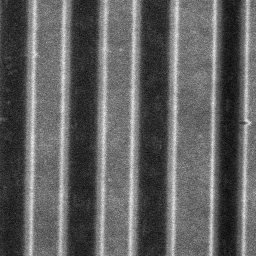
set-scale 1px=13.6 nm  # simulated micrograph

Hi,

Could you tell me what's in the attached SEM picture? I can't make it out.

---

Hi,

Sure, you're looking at one or a few lines or trenches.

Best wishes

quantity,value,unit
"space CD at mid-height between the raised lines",498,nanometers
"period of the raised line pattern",993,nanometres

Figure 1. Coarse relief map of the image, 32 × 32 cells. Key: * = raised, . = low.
....****.....****.....*****....*
....****.....****.....*****....*
....****.....****.....*****....*
....****.....****.....*****....*
....****.....****.....*****....*
....****.....****.....*****....*
....****.....****.....*****....*
....****.....****.....*****....*
....****.....****.....*****....*
....****.....****.....*****....*
....****.....****.....*****...**
....****.....****.....*****...**
....****.....****.....*****...**
....****.....****.....*****...**
....****.....****.....*****...**
....****.....****.....*****...**
....****.....****.....*****...**
....****.....****.....*****...**
....****.....****.....*****...**
....****.....****....******...**
....****.....****....******...**
....****.....****....******...**
....****.....****....******...**
....****.....****....******...**
....****.....****....******...**
....****.....****....******...**
....****.....****....******...**
....****.....****....******...**
....****.....****....******...**
....****.....****....******...**
....****....*****....******...**
....****....*****....******...**